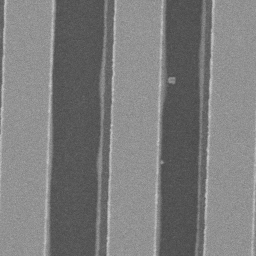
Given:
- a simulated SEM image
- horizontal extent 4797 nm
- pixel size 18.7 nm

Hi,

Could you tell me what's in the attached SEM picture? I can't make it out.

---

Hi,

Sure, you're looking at lines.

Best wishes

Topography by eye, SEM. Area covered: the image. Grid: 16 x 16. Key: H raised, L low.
HHHLLLLHHHLLLHHH
HHHLLLLHHHLLLHHH
HHHLLLLHHHLLLHHH
HHHLLLLHHHLLLHHH
HHHLLLLHHHLLLHHH
HHHLLLHHHHLLLHHH
HHHLLLHHHHLLLHHH
HHHLLLHHHHLLLHHH
HHHLLLHHHHLLLHHH
HHHLLLHHHHLLLHHH
HHHLLLHHHHLLLHHH
HHHLLLHHHHLLHHHH
HHHLLLHHHHLLHHHH
HHHLLLHHHHLLHHHH
HHHLLLHHHHLLHHHH
HHHLLLHHHHLLHHHH